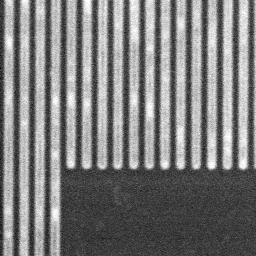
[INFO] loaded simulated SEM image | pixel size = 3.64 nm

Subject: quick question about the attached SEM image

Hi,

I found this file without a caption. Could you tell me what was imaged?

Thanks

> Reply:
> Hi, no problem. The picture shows parallel lines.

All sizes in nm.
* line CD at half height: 26.4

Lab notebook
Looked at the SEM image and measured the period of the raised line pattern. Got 56.8 nanometres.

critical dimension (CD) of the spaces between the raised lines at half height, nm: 29.6